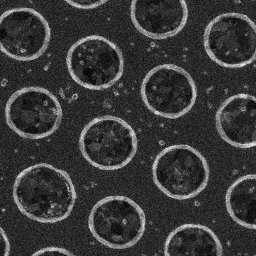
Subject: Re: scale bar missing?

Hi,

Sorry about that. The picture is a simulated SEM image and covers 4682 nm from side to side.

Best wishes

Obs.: raised bodies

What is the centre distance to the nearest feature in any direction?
1430 nm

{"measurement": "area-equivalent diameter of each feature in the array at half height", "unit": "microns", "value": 0.941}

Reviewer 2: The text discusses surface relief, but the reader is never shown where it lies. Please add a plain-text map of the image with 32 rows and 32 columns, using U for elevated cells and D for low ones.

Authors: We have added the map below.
DDDDDDDDDUUUDDDDDUUUUUUDDDDDDDDD
DUUUDDDDDDDDDDDDDUUUUUUDDDDDDDDD
UUUUUDDDDDDDDDDDDUUUUUUDDDDUUUUD
UUUUUUDDDDDDDDDDDUUUUUDDDDUUUUUU
UUUUUUDDDDDDDDDDDDDUUDDDDDUUUUUU
UUUUUUDDDDUUUUDDDDDDDDDDDDUUUUUU
DUUUUDDDDUUUUUUDDDDDDDDDDDUUUUUU
DDDDDDDDDUUUUUUDDDDDDDDDDDDUUUUD
DDDDDDDDDUUUUUUDDDDDUUDDDDDDDDDD
DDDDDDDDDUUUUUUDDDDUUUUDDDDDDDDD
DDDDDDDDDDUUUUDDDDUUUUUUDDDDDDDD
DDDUUUDDDDDDDDDDDDUUUUUUDDDDDDDD
DUUUUUUDDDDDDDDDDDUUUUUUDDDDDUUU
DUUUUUUDDDDDDDDDDDDUUUUUDDDDUUUU
DUUUUUUDDDDDDDDDDDDDDDDDDDDUUUUU
DUUUUUUDDDDUUUUUDDDDDDDDDDDUUUUU
DDUUUUDDDDDUUUUUDDDDDDDDDDDDUUUU
DDDDDDDDDDUUUUUUUDDDDDDDDDDDUUUU
DDDDDDDDDDUUUUUUUDDDDUUUDDDDDDDD
DDDDDDDDDDDUUUUUDDDDUUUUUDDDDDDD
DDDDDDDDDDDDUUUDDDDUUUUUUUDDDDDD
DDDUUUUUDDDDDDDDDDDUUUUUUUDDDDDD
DDUUUUUUUDDDDDDDDDDDUUUUUUDDDDUU
DDUUUUUUUDDDDDDDDDDDUUUUUDDDDUUU
DDUUUUUUUDDDDDDDDDDDDDUUDDDDDUUU
DDUUUUUUUDDDUUUUUDDDDDDDDDDDDUUU
DDDUUUUUUDDDUUUUUUDDDDDDDDDDDUUU
DDDDDUUDDDDUUUUUUUDDDDDDDDDDDDUU
DDDDDDDDDDDUUUUUUUDDDDDUUDDDDDDD
UDDDDDDDDDDDUUUUUDDDDUUUUUUDDDDD
UDDDDDDDDDDDDDUUDDDDDUUUUUUDDDDD
UDDDDUUUDDDDDDDDDDDDDUUUUUUDDDDD